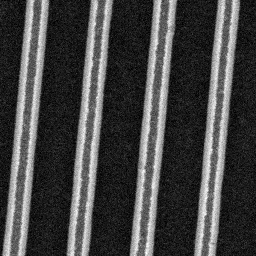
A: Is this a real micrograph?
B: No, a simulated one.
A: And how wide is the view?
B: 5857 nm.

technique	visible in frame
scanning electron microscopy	parallel lines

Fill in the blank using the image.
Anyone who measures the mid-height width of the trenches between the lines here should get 1090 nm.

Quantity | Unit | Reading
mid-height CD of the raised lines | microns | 0.356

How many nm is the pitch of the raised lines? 1450